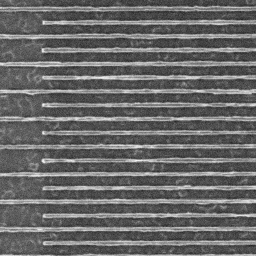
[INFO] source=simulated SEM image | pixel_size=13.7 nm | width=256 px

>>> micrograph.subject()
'parallel lines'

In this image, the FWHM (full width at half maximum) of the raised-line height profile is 37.7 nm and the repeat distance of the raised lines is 189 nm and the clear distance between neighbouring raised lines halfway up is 0.151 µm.